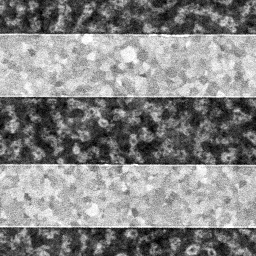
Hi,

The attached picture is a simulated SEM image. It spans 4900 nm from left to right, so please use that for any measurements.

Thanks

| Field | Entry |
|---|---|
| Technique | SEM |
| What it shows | one or a few lines or trenches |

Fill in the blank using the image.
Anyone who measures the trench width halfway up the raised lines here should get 1300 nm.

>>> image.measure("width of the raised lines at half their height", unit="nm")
1190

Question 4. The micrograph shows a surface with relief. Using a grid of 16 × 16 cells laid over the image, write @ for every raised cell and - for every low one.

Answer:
----------------
----------------
@@@@@@@@@@@@@@@@
@@@@@@@@@@@@@@@@
@@@@@@@@@@@@@@@@
@@@@@@@@@@@@@@@@
----------------
----------------
----------------
----------------
@@@@@@@@@@@@@@@@
@@@@@@@@@@@@@@@@
@@@@@@@@@@@@@@@@
@@@@@@@@@@@@@@@@
----------------
----------------